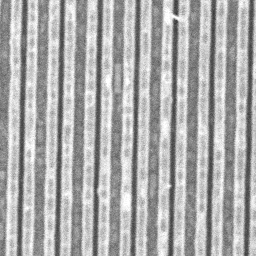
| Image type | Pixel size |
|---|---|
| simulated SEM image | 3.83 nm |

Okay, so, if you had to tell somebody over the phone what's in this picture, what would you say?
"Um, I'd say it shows parallel lines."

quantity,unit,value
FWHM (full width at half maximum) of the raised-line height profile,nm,36.4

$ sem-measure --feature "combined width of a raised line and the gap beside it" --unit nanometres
72.3